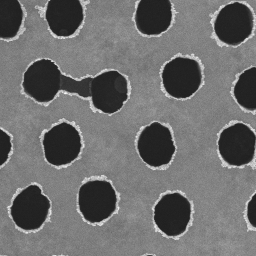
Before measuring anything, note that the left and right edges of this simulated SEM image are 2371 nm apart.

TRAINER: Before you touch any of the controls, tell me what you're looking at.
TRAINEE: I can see holes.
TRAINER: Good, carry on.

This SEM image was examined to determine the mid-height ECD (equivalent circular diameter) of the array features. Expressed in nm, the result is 369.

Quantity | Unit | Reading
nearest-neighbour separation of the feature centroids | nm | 655